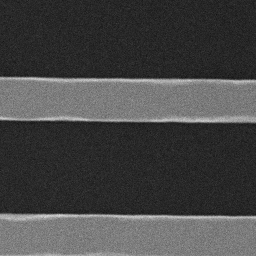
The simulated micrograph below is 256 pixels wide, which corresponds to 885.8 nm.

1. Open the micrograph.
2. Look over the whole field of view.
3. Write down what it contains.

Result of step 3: wiring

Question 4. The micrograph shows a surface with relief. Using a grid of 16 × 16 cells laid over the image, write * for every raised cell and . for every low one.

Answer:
................
................
................
................
................
****************
****************
.....*********..
................
................
................
................
................
...****.........
*...************
****************